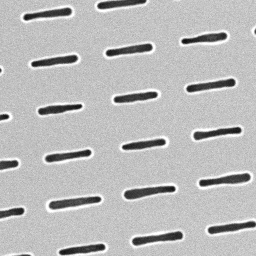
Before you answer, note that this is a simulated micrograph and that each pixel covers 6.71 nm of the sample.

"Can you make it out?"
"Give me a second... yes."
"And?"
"a regular array of holes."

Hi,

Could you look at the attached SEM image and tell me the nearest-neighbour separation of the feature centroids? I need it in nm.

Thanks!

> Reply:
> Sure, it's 319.